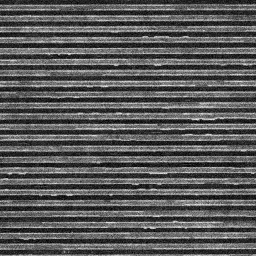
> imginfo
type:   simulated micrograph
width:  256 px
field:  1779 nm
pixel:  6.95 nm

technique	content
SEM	parallel lines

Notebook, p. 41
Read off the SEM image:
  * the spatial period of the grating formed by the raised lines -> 0.0755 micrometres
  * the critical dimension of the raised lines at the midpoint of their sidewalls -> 40.8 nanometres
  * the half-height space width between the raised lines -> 33.9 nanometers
